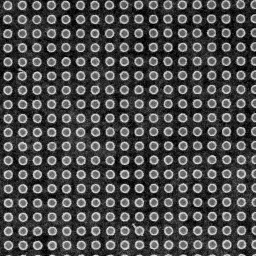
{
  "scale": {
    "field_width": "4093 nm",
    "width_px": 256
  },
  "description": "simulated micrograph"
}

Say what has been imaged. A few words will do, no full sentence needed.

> a regular array of raised bodies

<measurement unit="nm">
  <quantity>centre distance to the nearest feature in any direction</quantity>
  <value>224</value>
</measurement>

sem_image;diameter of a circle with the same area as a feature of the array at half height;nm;129